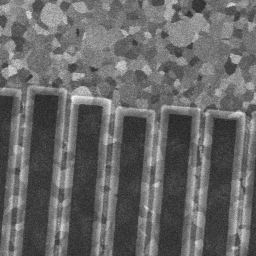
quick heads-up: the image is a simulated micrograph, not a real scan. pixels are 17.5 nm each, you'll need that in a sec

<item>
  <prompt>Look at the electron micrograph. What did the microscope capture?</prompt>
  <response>parallel lines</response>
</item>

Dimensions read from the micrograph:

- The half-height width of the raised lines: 0.244 micrometres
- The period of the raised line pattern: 0.787 um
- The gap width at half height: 0.54 µm